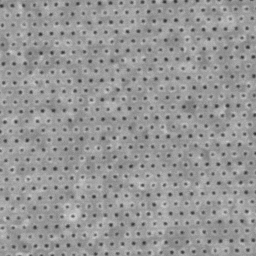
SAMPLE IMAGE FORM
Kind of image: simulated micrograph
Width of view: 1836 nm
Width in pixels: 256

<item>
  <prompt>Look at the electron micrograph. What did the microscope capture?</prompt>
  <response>a regular array of holes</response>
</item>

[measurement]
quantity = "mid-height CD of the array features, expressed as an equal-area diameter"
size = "4.37 pixels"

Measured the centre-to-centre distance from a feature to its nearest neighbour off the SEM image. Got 75.6 nanometers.